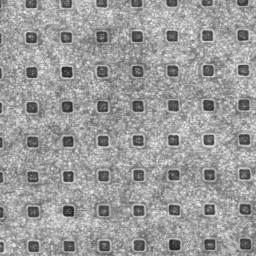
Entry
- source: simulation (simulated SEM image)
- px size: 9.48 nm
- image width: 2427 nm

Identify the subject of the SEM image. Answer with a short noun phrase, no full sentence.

a regular array of holes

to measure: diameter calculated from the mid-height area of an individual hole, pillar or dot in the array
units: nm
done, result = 118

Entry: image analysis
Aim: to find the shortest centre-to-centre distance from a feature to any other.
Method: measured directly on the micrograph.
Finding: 0.33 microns